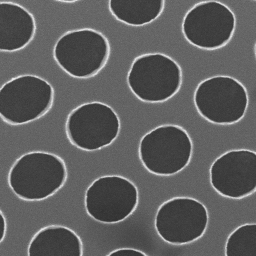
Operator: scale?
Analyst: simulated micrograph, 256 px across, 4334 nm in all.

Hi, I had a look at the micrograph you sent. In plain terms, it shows a regular array of holes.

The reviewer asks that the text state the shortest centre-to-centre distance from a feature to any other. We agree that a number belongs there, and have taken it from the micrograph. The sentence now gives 73.6 pixels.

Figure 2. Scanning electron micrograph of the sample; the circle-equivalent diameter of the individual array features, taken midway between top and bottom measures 817 nanometres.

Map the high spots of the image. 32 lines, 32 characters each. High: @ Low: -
-@@@@@@@@@@@@@------@@@@@--@@@@@
---@@@@@@@@@@@------@@@@-----@@@
----@@@@@@@@@@@----@@@@------@@@
----@@@@@@@@@@@@@@@@@@@------@@@
----@@@@-----@@@@@@@@@@------@@@
---@@@@------@@@@@@@@@@@----@@@@
@@@@@@@------@@@@@@@@@@@@@@@@@@@
@@@@@@@------@@@@----@@@@@@@@@@@
@@@@@@@@----@@@@@-----@@@@@@@@@@
@@@@@@@@@@-@@@@@-------@@@@@@@@@
@-----@@@@@@@@@@------@@@-----@@
------@@@@@@@@@@@-----@@@------@
------@@@@@@@@@@@@--@@@@-------@
------@@@@----@@@@@@@@@@@------@
-----@@@@-----@@@@@@@@@@@@----@@
@@@@@@@@-------@@@@@@@@@@@@@@@@@
@@@@@@@@@------@@@@----@@@@@@@@@
@@@@@@@@@-----@@@@------@@@@@@@@
@@@@@@@@@@--@@@@@@------@@@@@@@@
@@@----@@@@@@@@@@@------@@@@----
@@------@@@@@@@@@@-----@@@@-----
@-------@@@@@@@@@@@---@@@@------
@-------@@@@----@@@@@@@@@@------
@@-----@@@@------@@@@@@@@@@-----
@@----@@@@@------@@@@@@@@@@@@-@@
@@@@@@@@@@@------@@@@----@@@@@@@
@@@@@@@@@@@-----@@@@------@@@@@@
@@@@@@@@@@@@---@@@@@------@@@@@@
@@@@@@--@@@@@@@@@@@@------@@@@--
@@@@@-----@@@@@@@@@@-----@@@@---
@@@@------@@@@@@@@@@@@@@@@@@----
@@@@------@@@@---@@@@@@@@@@@----